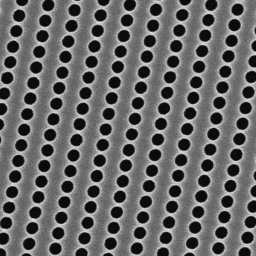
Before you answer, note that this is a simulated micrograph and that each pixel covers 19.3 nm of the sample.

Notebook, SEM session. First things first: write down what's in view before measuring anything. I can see a regular array of holes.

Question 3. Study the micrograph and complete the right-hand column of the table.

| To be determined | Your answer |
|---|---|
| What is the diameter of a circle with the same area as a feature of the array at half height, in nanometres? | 244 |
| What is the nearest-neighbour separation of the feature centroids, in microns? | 0.305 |